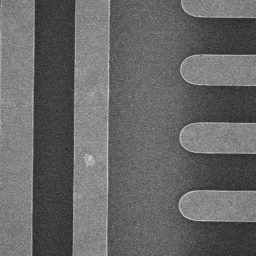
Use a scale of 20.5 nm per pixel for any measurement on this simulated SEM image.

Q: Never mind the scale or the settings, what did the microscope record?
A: groups of lines, slits or small figures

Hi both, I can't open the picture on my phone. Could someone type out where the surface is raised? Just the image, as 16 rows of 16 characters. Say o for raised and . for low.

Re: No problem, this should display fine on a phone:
oo...oo.....oooo
oo...oo.........
oo...oo.........
oo...oo.....oooo
oo...oo....ooooo
oo...oo.........
oo...oo.........
oo...oo.........
oo...oo....ooooo
oo...oo.....oooo
oo...oo.........
oo...oo.........
oo...oo....ooooo
oo...oo.....oooo
oo...oo.........
oo...oo.........